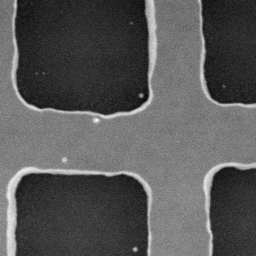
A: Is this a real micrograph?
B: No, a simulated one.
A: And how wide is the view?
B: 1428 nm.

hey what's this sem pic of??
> holes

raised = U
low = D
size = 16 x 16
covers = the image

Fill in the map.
UDDDDDDDDUUUUDDD
UDDDDDDDDUUUUDDD
UDDDDDDDDUUUUDDD
UDDDDDDDDUUUUDDD
UDDDDDDDDUUUUDDD
UDDDDDDDDUUUUDDD
UUDDDDDDDUUUUUUD
UUUUUUUUUUUUUUUU
UUUUUUUUUUUUUUUU
UUUUUUUUUUUUUUUU
UUUUUUUUUUUUUUDD
UDDDDDDDDUUUUDDD
UDDDDDDDDUUUUDDD
UDDDDDDDDUUUUDDD
UDDDDDDDDUUUUDDD
UDDDDDDDDUUUUDDD